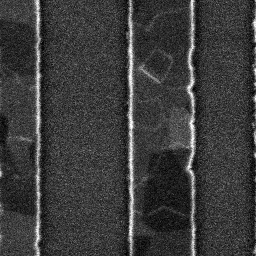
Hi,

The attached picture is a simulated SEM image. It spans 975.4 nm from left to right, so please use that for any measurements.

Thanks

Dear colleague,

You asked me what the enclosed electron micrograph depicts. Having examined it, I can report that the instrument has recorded one or a few lines or trenches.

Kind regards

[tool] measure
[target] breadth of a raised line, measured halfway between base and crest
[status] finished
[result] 0.235 um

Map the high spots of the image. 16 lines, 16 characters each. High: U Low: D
UUDDDDDDUUUUDDDD
UUDDDDDDUUUUDDDD
UUDDDDDDUUUUDDDD
UUDDDDDDUUUUDDDD
UUDDDDDDUUUUDDDD
UUDDDDDDUUUUDDDD
UUDDDDDDUUUUDDDD
UUDDDDDDUUUUDDDD
UUDDDDDDUUUUDDDD
UUDDDDDDUUUUDDDD
UUDDDDDDUUUUDDDD
UUDDDDDDUUUUDDDD
UUDDDDDDUUUUDDDD
UUDDDDDDUUUUDDDD
UUDDDDDDUUUUDDDD
UUDDDDDDUUUUDDDD